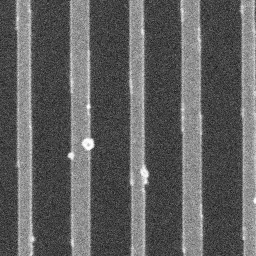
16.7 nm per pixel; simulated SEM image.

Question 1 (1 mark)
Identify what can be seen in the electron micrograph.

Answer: lines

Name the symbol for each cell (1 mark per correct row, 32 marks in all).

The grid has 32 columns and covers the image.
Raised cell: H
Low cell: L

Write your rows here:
LLHHLLLLLHHLLLLLHHLLLLLHHLLLLLHH
LLHHLLLLLHHLLLLLHHLLLLLHHLLLLLHH
LLHHLLLLLHHLLLLLHHLLLLLHHLLLLLHH
LLHHLLLLLHHLLLLLHHLLLLLHHLLLLLHH
LLHHLLLLLHHLLLLLHHLLLLLHHLLLLLHH
LLHHLLLLLHHLLLLLHHLLLLLHHLLLLLHH
LLHHLLLLLHHLLLLLHHLLLLLHHLLLLLHH
LLHHLLLLLHHLLLLLHHLLLLLHHLLLLLHH
LLHHLLLLLHHLLLLLHHLLLLLHHLLLLLHH
LLHHLLLLLHHLLLLLHHLLLLLHHLLLLLHH
LLHHLLLLLHHLLLLLHHLLLLLHHLLLLLHH
LLHHLLLLLHHLLLLLHHLLLLLHHLLLLLHH
LLHHLLLLLHHLLLLLHHLLLLLHHLLLLLHH
LLHHLLLLLHHLLLLLHHLLLLLHHLLLLLHH
LLHHLLLLLHHLLLLLHHLLLLLHHLLLLLHH
LLHHLLLLLHHLLLLLHHLLLLLHHLLLLLHH
LLHHLLLLLHHLLLLLHHLLLLLHHLLLLLHH
LLHHLLLLLHHLLLLLHHLLLLLHHLLLLLHH
LLHHLLLLLHHLLLLLHHLLLLLHHLLLLLHH
LLHHLLLLLHHLLLLLHHLLLLLHHLLLLLHH
LLHHLLLLLHHLLLLLHHLLLLLHHLLLLLHH
LLHHLLLLLHHLLLLLHHLLLLLHHLLLLLHH
LLHHLLLLLHHLLLLLHHLLLLLHHLLLLLHH
LLHHLLLLLHHLLLLLLHLLLLLHHLLLLLHH
LLHHLLLLLHHLLLLLLHLLLLLHHLLLLLHH
LLHHLLLLLHHLLLLLLHLLLLLHHLLLLLHH
LLHHLLLLLHHLLLLLLHLLLLLHHLLLLLHH
LLHHLLLLLHHLLLLLLHLLLLLHHLLLLLHH
LLHHLLLLLHHLLLLLLHLLLLLHHLLLLLHH
LLHHLLLLLHHLLLLLLHLLLLLHHLLLLLHH
LLHHLLLLLHHLLLLLLHLLLLLHHLLLLLLH
LLHHLLLLLHHLLLLLLHLLLLLHHLLLLLLH